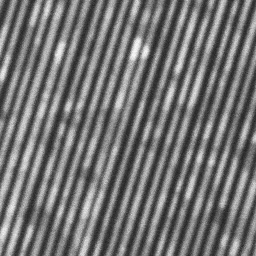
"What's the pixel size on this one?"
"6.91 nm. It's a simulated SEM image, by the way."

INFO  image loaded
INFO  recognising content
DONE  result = parallel lines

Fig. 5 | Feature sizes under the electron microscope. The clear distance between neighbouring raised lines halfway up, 49.4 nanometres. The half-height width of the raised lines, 31.3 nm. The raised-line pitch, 0.0817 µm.